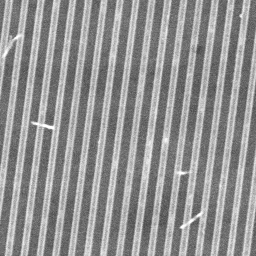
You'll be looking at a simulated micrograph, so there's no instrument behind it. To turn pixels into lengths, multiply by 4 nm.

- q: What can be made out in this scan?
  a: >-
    parallel lines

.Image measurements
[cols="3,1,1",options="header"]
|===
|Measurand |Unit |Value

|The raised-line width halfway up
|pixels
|5.58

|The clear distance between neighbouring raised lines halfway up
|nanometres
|40.7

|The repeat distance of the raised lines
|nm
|62.9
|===